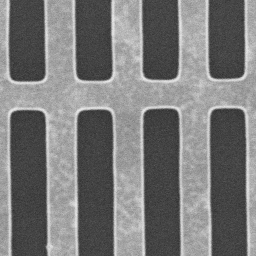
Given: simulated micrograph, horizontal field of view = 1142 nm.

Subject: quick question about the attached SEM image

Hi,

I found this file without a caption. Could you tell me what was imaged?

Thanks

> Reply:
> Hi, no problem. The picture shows groups of lines, slits or small figures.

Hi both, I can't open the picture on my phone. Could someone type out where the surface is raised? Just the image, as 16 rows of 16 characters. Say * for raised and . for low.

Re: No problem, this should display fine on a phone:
...**..**..**..*
...**..**..**..*
...**..**..**..*
...**..**..**..*
*..**..**..**..*
****************
****************
*..**..**..**..*
*..**..**..**..*
*..**..**..**..*
*..**..**..**..*
*..**..**..**...
*..**..**..**...
*..**..**..**...
*..**..**..**...
*..**..**..**...